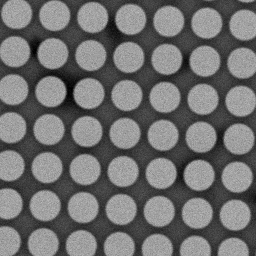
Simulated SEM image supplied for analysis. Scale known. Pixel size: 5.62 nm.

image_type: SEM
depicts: an array of small figures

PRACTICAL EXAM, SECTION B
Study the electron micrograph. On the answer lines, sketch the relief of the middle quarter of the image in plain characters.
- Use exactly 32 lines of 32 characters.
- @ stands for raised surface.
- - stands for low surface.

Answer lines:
----@@@@@----@@@@@@---@@@@@@@---
------@-------@@@@-----@@@@@----
-------------------------@------
--------------------------------
----@@@@------@@@---------------
---@@@@@@@---@@@@@@----@@@@@----
---@@@@@@@--@@@@@@@---@@@@@@@---
---@@@@@@@--@@@@@@@---@@@@@@@--@
---@@@@@@@--@@@@@@@---@@@@@@@--@
---@@@@@@---@@@@@@@---@@@@@@@--@
----@@@@-----@@@@@@---@@@@@@---@
---------------@@------@@@@-----
--------------------------------
----@@@@------------------------
---@@@@@@----@@@@@-----@@@------
--@@@@@@@---@@@@@@@---@@@@@@----
--@@@@@@@---@@@@@@@--@@@@@@@---@
--@@@@@@@--@@@@@@@@--@@@@@@@@--@
--@@@@@@@---@@@@@@@--@@@@@@@---@
---@@@@@----@@@@@@----@@@@@@---@
-----@@------@@@@-----@@@@@----@
-------------------------@------
--------------------------------
---@@@@@-----@@@----------------
--@@@@@@----@@@@@@----@@@@@-----
--@@@@@@@--@@@@@@@---@@@@@@----@
--@@@@@@@--@@@@@@@---@@@@@@@--@@
--@@@@@@@--@@@@@@@---@@@@@@@--@@
--@@@@@@---@@@@@@@---@@@@@@@--@@
---@@@@-----@@@@@@---@@@@@@---@@
--------------@-------@@@@@----@
--------------------------------